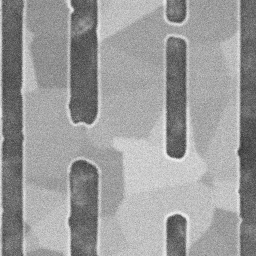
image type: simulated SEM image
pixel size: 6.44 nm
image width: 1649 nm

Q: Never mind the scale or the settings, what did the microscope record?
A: one or a few lines or trenches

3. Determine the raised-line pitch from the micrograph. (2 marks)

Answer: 537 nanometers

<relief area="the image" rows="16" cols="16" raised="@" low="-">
-@@@--@@@@--@@@-
-@@@--@@@@@@@@@-
-@@@--@@@@@@@@@-
-@@@--@@@@--@@@-
-@@@--@@@@--@@@-
-@@@--@@@@--@@@-
-@@@--@@@@--@@@-
-@@@@-@@@@--@@@-
-@@@@@@@@@--@@@-
-@@@@@@@@@--@@@-
-@@@--@@@@@@@@@-
-@@@--@@@@@@@@@-
-@@@--@@@@@@@@@-
-@@@--@@@@@@@@@-
-@@@--@@@@--@@@-
-@@@--@@@@--@@@-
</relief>